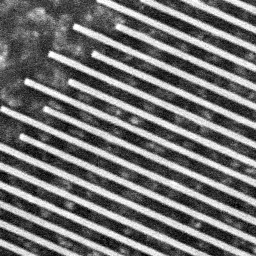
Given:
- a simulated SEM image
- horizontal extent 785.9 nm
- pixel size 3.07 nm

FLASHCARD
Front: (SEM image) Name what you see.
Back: parallel lines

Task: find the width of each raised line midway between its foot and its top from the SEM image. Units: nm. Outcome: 16.1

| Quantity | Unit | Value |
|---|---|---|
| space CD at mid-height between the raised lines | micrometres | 0.0374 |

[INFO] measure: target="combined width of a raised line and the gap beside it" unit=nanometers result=53.7